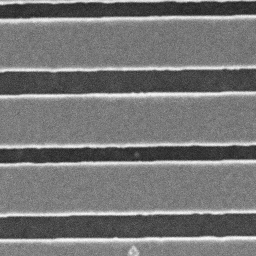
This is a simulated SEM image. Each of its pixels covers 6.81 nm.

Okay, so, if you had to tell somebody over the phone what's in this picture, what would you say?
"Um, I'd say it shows lines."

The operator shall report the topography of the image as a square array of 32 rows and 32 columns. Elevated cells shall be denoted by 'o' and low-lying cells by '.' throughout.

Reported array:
o...............................
................................
oooooooooooooooooooooooooooooooo
oooooooooooooooooooooooooooooooo
oooooooooooooooooooooooooooooooo
oooooooooooooooooooooooooooooooo
oooooooooooooooooooooooooooooooo
oooooooooooooooooooooooooooooooo
oooooooooooooooooooooooooooooo..
................................
................................
................................
oooooooooooooooooooooooooooooooo
oooooooooooooooooooooooooooooooo
oooooooooooooooooooooooooooooooo
oooooooooooooooooooooooooooooooo
oooooooooooooooooooooooooooooooo
oooooooooooooooooooooooooooooooo
ooo.oo..........................
................................
..oo.ooooooooooooooooooooooooooo
oooooooooooooooooooooooooooooooo
oooooooooooooooooooooooooooooooo
oooooooooooooooooooooooooooooooo
oooooooooooooooooooooooooooooooo
oooooooooooooooooooooooooooooooo
oooooooooooooooooooooooooooooooo
................................
................................
................................
oooooooooooooooooooooooooooooooo
oooooooooooooooooooooooooooooooo